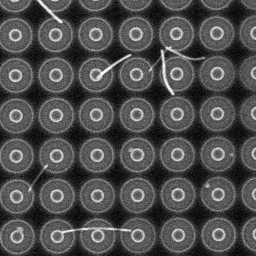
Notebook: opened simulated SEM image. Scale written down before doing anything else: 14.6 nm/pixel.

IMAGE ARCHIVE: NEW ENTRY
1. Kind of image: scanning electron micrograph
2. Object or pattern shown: an array of small figures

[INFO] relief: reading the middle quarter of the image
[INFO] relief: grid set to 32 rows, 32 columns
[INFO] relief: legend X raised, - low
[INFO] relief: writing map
-XXXX------XXXX-------XXX-------
--XX---XX-X-XX---XX---XXX--XX---
--XX---XXX--XX---XXX--XX---XXX--
--XX---XX---XX---XX---XX---XX---
--XX--------XXX-------XXXX------
-XXXX------XXXXX-----XXXXX-----X
XXXXXXX--XXXXXXXX-XXXXXXXXX--XXX
XXXXXXXXXXXXXXXXXXXXXXXXXXXXXXXX
XXXXXXXXXXXXXXXXXXXXXXXXXXX--XXX
-XXXXX----XXXXXX-----XXXXX-----X
--XXX-------XXX-------XXX-------
--XX---XX---XX---XX---XX---XX---
--XX---XX---XX---XXX--XX---XXX--
--XX---XX---XX---XX---XX---XX---
--XX--------XXX-------XXX-------
-XXXX------XXXX------XXXXX-----X
XXXXXX----XXXXXXX---XXXXXXX--XXX
XXXXXXXXXXXXXXXXXXXXXXXXXXXXXXXX
XXXXXXXXXXXXXXXXXXXXXXXXXXXXXXXX
XXXXXX-----XXXXX-----XXXXX-----X
-XXXX-------XXX-------XXX-------
--XX----X---XXX--XX---XX---XX---
--XX---XXX--XX---XXX---X---XXX--
--XX---XXX--XX---XXX--XX---XXX--
--XXX-------XXX-------XXX-------
-XXXX------XXXX------XXXX------X
XXXXXX----XXXXXXX---XXXXXXX---XX
XXXXXXXXXXXXXXXXXXXXXXXXXXXXXXXX
XXXXXXXXXXXXXXXXXXXXXXXXXXXXXXXX
XXXXXX----XXXXXX-----XXXXX-----X
-XXXX-------XXX-------XXX-------
--XXX-------XXX---X---XXX---X---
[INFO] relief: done